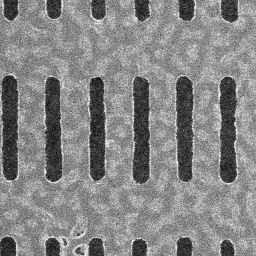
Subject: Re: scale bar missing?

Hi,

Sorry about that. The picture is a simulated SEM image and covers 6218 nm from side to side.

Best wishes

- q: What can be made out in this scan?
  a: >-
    holes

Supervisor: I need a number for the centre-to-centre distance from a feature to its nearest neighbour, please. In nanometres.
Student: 1060